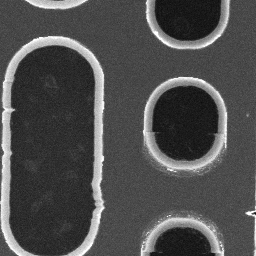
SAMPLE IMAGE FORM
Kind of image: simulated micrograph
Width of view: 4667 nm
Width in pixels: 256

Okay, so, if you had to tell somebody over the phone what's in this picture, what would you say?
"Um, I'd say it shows one or a few lines or trenches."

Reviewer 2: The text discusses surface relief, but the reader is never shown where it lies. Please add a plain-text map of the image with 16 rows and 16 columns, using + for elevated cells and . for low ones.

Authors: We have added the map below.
+++++++++.....++
++++++++++....++
+++++++++++..+++
+.....++++++++++
+.....++++++++++
......++++...+++
......+++.....++
......+++.....++
......+++.....++
......++++...+++
......++++++++++
......++++++++++
......++++++++++
......++++++++++
......++++...+++
+....++++....+++